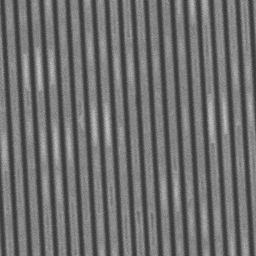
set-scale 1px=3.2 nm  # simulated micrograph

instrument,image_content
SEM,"parallel lines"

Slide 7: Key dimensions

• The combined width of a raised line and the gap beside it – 41.7 nm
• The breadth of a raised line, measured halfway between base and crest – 24.7 nm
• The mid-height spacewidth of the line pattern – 16.3 nm